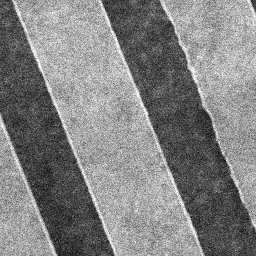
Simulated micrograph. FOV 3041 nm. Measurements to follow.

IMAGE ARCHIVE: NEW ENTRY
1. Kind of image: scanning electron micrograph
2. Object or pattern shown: one or a few lines or trenches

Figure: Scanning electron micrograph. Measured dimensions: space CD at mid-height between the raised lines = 690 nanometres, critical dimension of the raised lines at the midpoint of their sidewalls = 0.941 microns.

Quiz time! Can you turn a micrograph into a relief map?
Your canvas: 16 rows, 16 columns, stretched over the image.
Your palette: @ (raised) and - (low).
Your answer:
-@@@@@----@@@@@@
-@@@@@@----@@@@@
--@@@@@----@@@@@
--@@@@@@----@@@@
---@@@@@----@@@@
---@@@@@----@@@@
---@@@@@@----@@@
----@@@@@----@@@
----@@@@@@----@@
@----@@@@@----@@
@----@@@@@----@@
@@---@@@@@@----@
@@----@@@@@----@
@@----@@@@@@----
@@@----@@@@@----
@@@----@@@@@----